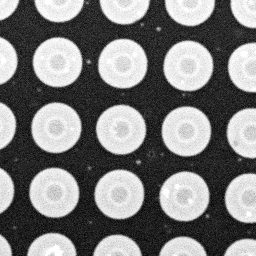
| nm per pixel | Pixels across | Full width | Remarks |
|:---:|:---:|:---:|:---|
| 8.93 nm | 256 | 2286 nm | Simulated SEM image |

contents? an array of small figures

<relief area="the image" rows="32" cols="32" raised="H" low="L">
HHLLHHHHHHLLLHHHHHHLLHHHHHHLLHHH
HHLLLHHHHHLLLHHHHHLLLHHHHHLLLHHH
LLLLLLHHHLLLLLHHHLLLLLHHHHLLLLHH
LLLLLLLLLLLLLLLLLLLLLLLLLLLLLLLL
LLLLLLLLLLLLLLLLLLLLLLLLLLLLLLLL
HLLLLHHHHLLLLLHHHLLLLLHHHLLLLLLH
HHLLHHHHHHLLLHHHHHLLLHHHHHLLLHHH
HHLLHHHHHHLLHHHHHHLLLHHHHHHLLHHH
HHLLHHHHHHLLHHHHHHLLLHHHHHHLLHHH
HLLLLHHHHHLLLHHHHHLLLHHHHHLLLHHH
LLLLLLHHHLLLLLHHHLLLLHHHHHLLLHHH
LLLLLLLLLLLLLLLLLLLLLLLLLLLLLLLL
LLLLLLLLLLLLLLLLLLLLLLLLLLLLLLLL
HLLLLHHHHLLLLLHHHLLLLLHHLLLLLLLL
HHLLHHHHHHLLLHHHHHLLLHHHHHLLLHHH
HHLLHHHHHHLLHHHHHHLLHHHHHHLLLHHH
HHLLHHHHHHLLHHHHHHLLHHHHHHLLHHHH
HLLLHHHHHHLLHHHHHHLLHHHHHHLLLHHH
LLLLLHHHHLLLLHHHHLLLLHHHHHLLLHHH
LLLLLLLLLLLLLLLLLLLLLLLLLLLLLLHH
LLLLLLLLLLLLLLLLLLLLLLLLLLLLLLLL
HLLLLHHHLLLLLLHHLLLLLLLLLLLLLLLL
HLLLHHHHHLLLLHHHHLLLLHHHHLLLLHHH
HHLLHHHHHHLLHHHHHHLLHHHHHHLLHHHH
HHLLHHHHHHLLHHHHHHLLHHHHHHLLHHHH
HLLLHHHHHHLLHHHHHHLLHHHHHHLLHHHH
LLLLLHHHHLLLLHHHHLLLLHHHHLLLLHHH
LLLLLLLLLLLLLLLLLLLLLLHHLLLLLLHH
LLLLLLLLLLLLLLLLLLLLLLLLLLLLLLLL
LLLLLHHHLLLLLLHHLLLLLLLLLLLLLLLL
HLLLHHHHHLLLHHHHHLLLLHHHHLLLLHHH
HLLLHHHHHLLLHHHHHHLLHHHHHHLLHHHH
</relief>